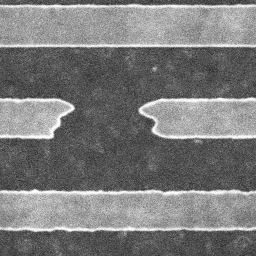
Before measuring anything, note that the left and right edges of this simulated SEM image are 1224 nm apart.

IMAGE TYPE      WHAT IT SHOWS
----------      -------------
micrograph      one or a few lines or trenches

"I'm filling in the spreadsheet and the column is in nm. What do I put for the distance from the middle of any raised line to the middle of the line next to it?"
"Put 441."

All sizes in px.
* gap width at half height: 53.8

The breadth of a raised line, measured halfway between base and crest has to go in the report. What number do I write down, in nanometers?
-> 188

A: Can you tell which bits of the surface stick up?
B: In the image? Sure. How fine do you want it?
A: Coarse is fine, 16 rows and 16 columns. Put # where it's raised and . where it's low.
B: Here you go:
################
################
################
................
................
................
####.....#######
####.....#######
###.......######
................
................
................
################
################
................
................